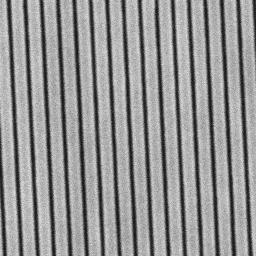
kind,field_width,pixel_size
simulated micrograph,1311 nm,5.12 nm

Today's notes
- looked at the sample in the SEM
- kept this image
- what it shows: parallel lines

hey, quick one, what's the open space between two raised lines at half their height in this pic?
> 19.8 nm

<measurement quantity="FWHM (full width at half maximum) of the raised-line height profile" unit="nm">63.9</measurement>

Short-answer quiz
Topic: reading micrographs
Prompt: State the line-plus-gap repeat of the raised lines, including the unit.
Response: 83.7 nm